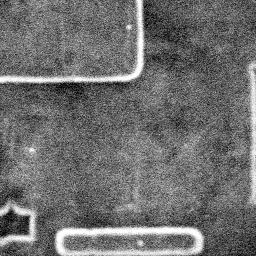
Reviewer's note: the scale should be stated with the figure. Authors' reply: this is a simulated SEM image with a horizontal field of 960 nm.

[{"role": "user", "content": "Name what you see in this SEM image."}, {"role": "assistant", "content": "wiring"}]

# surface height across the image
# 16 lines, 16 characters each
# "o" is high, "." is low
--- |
ooooooooo.......
ooooooooo.......
ooooooooo.......
ooooooooo.......
ooooooooo.......
................
................
................
................
................
................
................
................
................
....oooooooo....
....oooooooo....